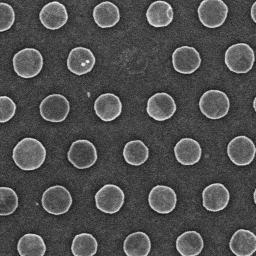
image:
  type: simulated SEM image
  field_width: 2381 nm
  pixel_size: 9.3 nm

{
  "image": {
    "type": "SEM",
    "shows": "a regular array of raised bodies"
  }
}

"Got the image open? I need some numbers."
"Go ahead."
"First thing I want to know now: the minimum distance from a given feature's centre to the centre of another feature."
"489 nm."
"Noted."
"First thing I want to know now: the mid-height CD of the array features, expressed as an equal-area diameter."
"257 nanometers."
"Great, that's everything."